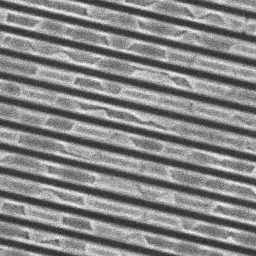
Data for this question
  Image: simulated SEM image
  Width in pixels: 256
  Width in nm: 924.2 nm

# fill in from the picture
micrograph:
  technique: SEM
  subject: parallel lines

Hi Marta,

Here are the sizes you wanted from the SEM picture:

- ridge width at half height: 15.2 px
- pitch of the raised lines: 83.3 nanometres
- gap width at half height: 27.2 nanometres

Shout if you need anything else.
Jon